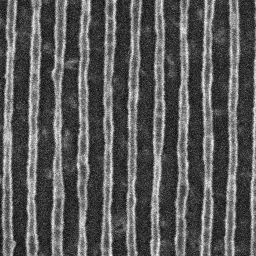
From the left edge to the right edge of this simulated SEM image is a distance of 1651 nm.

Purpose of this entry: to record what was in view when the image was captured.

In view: parallel lines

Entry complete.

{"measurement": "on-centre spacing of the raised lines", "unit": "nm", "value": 160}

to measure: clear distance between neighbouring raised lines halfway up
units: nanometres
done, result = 114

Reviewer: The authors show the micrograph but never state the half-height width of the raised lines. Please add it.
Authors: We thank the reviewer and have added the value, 7.36 px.